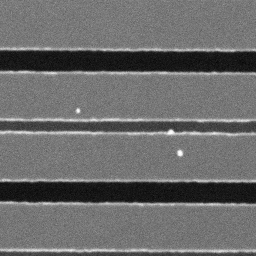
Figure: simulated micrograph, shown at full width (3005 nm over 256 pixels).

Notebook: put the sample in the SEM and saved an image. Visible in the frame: lines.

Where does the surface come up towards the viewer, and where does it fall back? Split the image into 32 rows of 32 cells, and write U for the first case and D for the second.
UUUUUUUUUUUUUUUUUUUUUUUUUUUUUUUU
UUUUUUUUUUUUUUUUUUUUUUUUUUUUUUUU
UUUUUUUUUUUUUUUUUUUUUUUUUUUUUUUU
UUUUUUUUUUUUUUUUUUUUUUUUUUUUUUUU
UUUUUUUUUUUUUUUUUUUUUUUUUUUUUUUU
UUUUUUUUUUUUUUUUUUUUUUUUUUUUUUUU
DDDDDDDDDDDDDDDDDDDDDDDDDDDDDDDD
DDDDDDDDDDDDDDDDDDDDDDDDDDDDDDDD
DDDDDDDDDDDDDDDDDDDDDDDDDDDDDDDD
UUUUUUUUUUUUUUUUUUUUUUUUUUUUUUUU
UUUUUUUUUUUUUUUUUUUUUUUUUUUUUUUU
UUUUUUUUUUUUUUUUUUUUUUUUUUUUUUUU
UUUUUUUUUUUUUUUUUUUUUUUUUUUUUUUU
UUUUUUUUUUUUUUUUUUUUUUUUUUUUUUUU
UUUUUUUUUUUUUUUUUUUUUUUUUUUUUUUU
UUUUUUUUUUUUUUUUUUUUUUUUUUUUUUUU
UUUUUUUUUUUUUUUUUUUUUUUUUUUUUUUU
UUUUUUUUUUUUUUUUUUUUUUUUUUUUUUUU
UUUUUUUUUUUUUUUUUUUUUUUUUUUUUUUU
UUUUUUUUUUUUUUUUUUUUUUUUUUUUUUUU
UUUUUUUUUUUUUUUUUUUUUUUUUUUUUUUU
UUUUUUUUUUUUUUUUUUUUUUUUUUUUUUUU
UUUUUUUUUUUUUUUUUUUUUUUUUUUUUUUU
DDDDDDDDDDDDDDDDDDDDDDDDDDDDDDDD
DDDDDDDDDDDDDDDDDDDDDDDDDDDDDDDD
UUUUUUUUUUUUUUUUUUUUUUUUUUUUDUUD
UUUUUUUUUUUUUUUUUUUUUUUUUUUUUUUU
UUUUUUUUUUUUUUUUUUUUUUUUUUUUUUUU
UUUUUUUUUUUUUUUUUUUUUUUUUUUUUUUU
UUUUUUUUUUUUUUUUUUUUUUUUUUUUUUUU
UUUUUUUUUUUUUUUUUUUUUUUUUUUUUUUU
UUUUUUUUUUUUUUUUUUUUUUUUUUUUUUUU